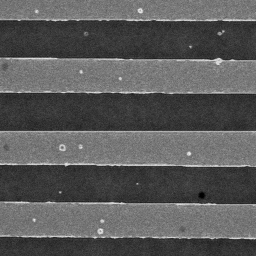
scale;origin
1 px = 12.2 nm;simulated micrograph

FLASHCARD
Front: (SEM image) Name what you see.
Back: lines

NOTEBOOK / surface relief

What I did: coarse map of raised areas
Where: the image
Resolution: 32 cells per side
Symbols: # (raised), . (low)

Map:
################################
################################
..#..#####..##.#################
................................
................................
................................
................................
################...........#....
################################
################################
################################
..#....#...##..#################
................................
................................
................................
................................
################################
################################
################################
################################
################################
................................
................................
................................
................................
################................
################################
################################
################################
..##############################
................................
................................